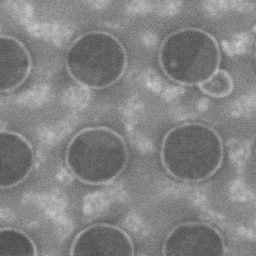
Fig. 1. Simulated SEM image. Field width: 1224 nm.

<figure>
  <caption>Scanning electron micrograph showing raised bodies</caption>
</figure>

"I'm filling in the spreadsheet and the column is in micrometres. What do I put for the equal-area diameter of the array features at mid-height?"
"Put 0.286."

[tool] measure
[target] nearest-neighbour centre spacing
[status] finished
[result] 0.448 microns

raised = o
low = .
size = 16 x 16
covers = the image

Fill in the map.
................
................
o....oo...ooo...
oo..oooo..oooo..
oo..oooo..oooo..
o............o..
................
................
o....oo...oooo..
oo..oooo..oooo..
oo..oooo..oooo..
o...............
................
................
o....ooo...ooo..
oo...ooo..oooo..